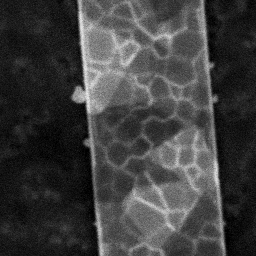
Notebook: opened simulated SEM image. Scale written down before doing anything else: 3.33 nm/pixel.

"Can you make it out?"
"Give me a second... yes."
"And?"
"one or a few lines or trenches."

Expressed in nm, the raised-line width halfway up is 413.